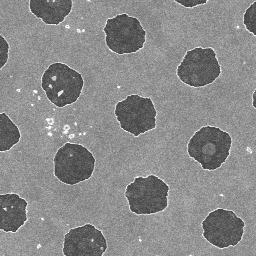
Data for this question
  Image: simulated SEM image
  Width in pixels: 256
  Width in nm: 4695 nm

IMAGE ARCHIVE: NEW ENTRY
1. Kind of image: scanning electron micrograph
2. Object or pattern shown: a regular array of holes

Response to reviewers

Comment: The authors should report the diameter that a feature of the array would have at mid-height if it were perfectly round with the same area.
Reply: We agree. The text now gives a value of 0.73 µm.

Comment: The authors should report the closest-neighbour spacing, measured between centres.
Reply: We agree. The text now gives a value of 1.46 µm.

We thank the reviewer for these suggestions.